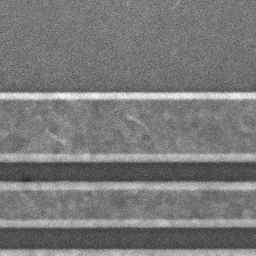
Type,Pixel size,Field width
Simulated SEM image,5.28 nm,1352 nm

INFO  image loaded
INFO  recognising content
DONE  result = one or a few lines or trenches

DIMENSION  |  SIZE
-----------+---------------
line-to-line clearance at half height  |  145 nm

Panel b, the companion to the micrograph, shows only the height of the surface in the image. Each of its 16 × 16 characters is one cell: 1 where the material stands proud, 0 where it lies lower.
0000000000000000
0000000000000000
0000000000000000
0000000000000000
0000000000000000
0000000000000000
1111111111111111
1111111111111111
1111111111111111
1111111111111111
0000000000000000
0000000000000000
1111111111111111
1111111111111111
0000000000000000
0000000000000000